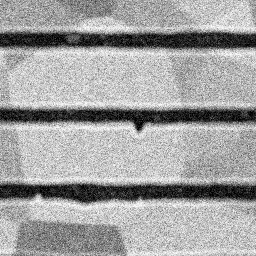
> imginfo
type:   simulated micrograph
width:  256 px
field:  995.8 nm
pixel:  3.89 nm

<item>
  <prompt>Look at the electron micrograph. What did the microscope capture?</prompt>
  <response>one or a few lines or trenches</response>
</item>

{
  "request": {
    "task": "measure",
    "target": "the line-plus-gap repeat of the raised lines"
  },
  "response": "291 nm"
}